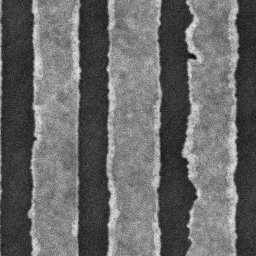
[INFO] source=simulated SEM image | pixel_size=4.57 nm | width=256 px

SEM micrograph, one or a few lines or trenches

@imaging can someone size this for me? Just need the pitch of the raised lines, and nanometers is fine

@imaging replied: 359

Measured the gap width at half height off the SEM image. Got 143 nanometres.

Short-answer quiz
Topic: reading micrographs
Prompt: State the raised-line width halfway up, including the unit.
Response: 214 nm